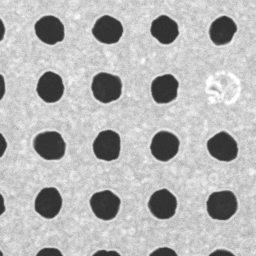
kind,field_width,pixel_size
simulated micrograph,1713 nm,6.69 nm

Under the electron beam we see a regular array of holes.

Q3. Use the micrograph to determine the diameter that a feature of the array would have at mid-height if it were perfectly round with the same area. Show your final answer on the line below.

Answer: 198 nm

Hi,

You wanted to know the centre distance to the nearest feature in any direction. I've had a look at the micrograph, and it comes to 57 pixels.